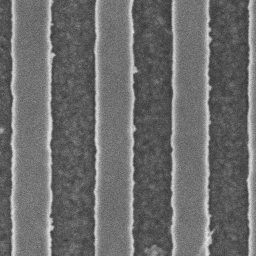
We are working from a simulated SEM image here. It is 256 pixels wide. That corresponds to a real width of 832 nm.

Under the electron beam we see lines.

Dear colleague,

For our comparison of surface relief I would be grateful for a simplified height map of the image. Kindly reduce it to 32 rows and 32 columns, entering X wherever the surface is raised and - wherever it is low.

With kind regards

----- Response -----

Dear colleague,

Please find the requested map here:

--XXXX------XXXXX-----XXXX-----X
--XXXX------XXXX------XXXX-----X
--XXXX------XXXXX-----XXXX-----X
--XXXX------XXXXX-----XXXX-----X
--XXXX------XXXXX-----XXXX-----X
-XXXXX------XXXXX-----XXXX-----X
--XXXX------XXXXX-----XXXX-----X
--XXXX------XXXXX-----XXXX-----X
--XXXX------XXXXX-----XXXX-----X
--XXXX------XXXXX-----XXXX-----X
-XXXXX------XXXXX-----XXXX-----X
--XXXX------XXXXX-----XXXX-----X
--XXXX------XXXXX-----XXXX-----X
--XXXX------XXXXX-----XXXX-----X
--XXXX------XXXXX-----XXXX-----X
--XXXX------XXXXX-----XXXX-----X
--XXXX------XXXXX-----XXXX-----X
-XXXXX------XXXXX----XXXXX-----X
--XXXX------XXXXX-----XXXX-----X
--XXXX------XXXXX----XXXXX-----X
--XXXX------XXXXX-----XXXX-----X
--XXXX------XXXXX-----XXXX-----X
--XXXX------XXXXX-----XXXX-----X
--XXXX------XXXXX----XXXXX-----X
-XXXXX------XXXXX-----XXXX-----X
-XXXXX------XXXXX----XXXXX-----X
--XXXX------XXXXX-----XXXX-----X
--XXXX------XXXXX-----XXXX-----X
--XXXX------XXXX-----XXXXX-----X
--XXXX------XXXXX----XXXXX-----X
--XXXX------XXXXX-----XXXX-----X
--XXXX------XXXXX-----XXXX-----X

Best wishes